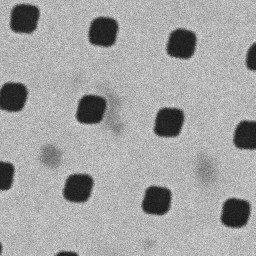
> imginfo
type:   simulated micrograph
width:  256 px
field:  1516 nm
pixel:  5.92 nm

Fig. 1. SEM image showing a regular array of holes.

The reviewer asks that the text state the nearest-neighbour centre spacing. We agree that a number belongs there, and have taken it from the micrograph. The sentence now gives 470 nanometres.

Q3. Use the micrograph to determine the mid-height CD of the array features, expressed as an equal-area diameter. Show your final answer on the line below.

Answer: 184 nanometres